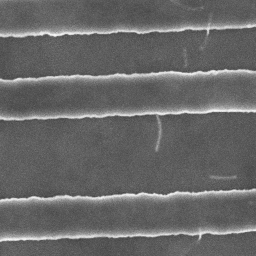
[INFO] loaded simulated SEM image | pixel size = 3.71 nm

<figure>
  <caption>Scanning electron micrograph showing lines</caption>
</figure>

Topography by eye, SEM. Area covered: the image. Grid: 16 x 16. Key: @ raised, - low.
@@@@@@@@@@@@@@@@
@@@@@@@@@@@@@@@@
----------------
----------------
----------@--@@@
@@@@@@@@@@@@@@@@
@@@@@@@@@@@@@@@@
----------------
----------------
----------------
----------------
----------------
@@@@@@@@@@@@@@@@
@@@@@@@@@@@@@@@@
@@@@@@@@@@@@@@@-
----------------